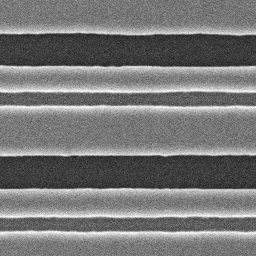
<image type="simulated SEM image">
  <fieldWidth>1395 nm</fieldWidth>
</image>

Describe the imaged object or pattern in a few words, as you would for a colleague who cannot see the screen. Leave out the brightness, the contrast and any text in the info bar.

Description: lines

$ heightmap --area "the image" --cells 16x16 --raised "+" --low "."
++++++++++++++++
++++++++++++++++
................
................
++++++++++++++++
++++++++++++++++
++++++++++++++++
++++++++++++++++
++++++++++++++++
++++++++++++++++
................
................
++++++++++++++++
++++++++++++++++
++++++++++++++++
++++++++++++++++